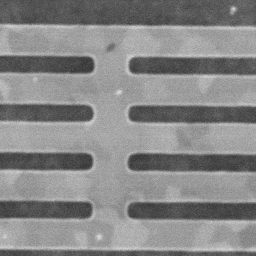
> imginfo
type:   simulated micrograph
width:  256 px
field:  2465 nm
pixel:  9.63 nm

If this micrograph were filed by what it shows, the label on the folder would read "groups of lines, slits or small figures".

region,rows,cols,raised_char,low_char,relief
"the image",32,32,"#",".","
................................
................................
................................
################################
################################
################################
################################
............####................
............####................
##############################..
################################
################################
################################
............####................
............####................
##################..............
################################
################################
################################
............####................
............####................
#################...............
################################
################################
################################
...........#####................
............####................
#################...............
################################
################################
################################
................................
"